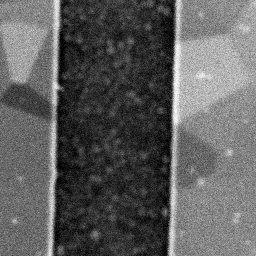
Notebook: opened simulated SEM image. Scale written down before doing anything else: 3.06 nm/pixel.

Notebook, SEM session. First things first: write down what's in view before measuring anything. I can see one or a few lines or trenches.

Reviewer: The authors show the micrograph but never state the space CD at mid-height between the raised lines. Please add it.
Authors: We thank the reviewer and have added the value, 364 nanometers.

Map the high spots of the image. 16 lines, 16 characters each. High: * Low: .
****.......*****
****.......*****
****.......*****
****.......*****
****.......*****
***........*****
***........*****
***........*****
***........*****
***........*****
***........*****
***........*****
***........*****
***........*****
***........*****
***........*****